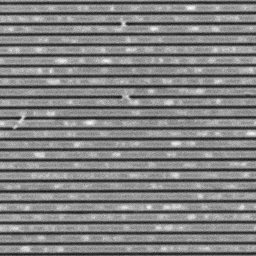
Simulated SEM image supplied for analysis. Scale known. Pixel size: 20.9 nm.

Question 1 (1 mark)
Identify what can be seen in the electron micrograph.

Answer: parallel lines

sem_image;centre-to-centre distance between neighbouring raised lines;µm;0.219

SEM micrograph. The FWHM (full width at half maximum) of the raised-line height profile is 134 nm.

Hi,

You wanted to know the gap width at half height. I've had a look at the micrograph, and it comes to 76 nanometers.